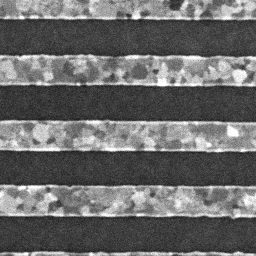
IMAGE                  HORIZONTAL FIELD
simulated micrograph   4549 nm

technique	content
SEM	one or a few lines or trenches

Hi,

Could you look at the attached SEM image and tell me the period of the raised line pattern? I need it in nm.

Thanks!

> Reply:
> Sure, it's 1160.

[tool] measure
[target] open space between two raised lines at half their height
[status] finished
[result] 675 nm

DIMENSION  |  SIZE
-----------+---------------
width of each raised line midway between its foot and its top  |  495 nm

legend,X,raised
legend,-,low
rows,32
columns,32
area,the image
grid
XXXXXXXXXXXXXXXXXXXXXXXXXXXXXXXX
XXXXXXXXXXXXXXXXXXXXXXXXXXXXXXXX
--------------------------------
--------------------------------
--------------------------------
--------------------------------
--------------------------------
XXXXXXXXXXXXXXXXXXXXXXXXXXXXXXXX
XXXXXXXXXXXXXXXXXXXXXXXXXXXXXXXX
XXXXXXXXXXXXXXXXXXXXXXXXXXXXXXXX
-----XX-XXX-------XXXXXXXXX-XXXX
--------------------------------
--------------------------------
--------------------------------
--------------------------------
XXXXXXXXXXXXXXXXXXXXXXXXXXXXXX-X
XXXXXXXXXXXXXXXXXXXXXXXXXXXXXXXX
XXXXXXXXXXXXXXXXXXXXXXXXXXXXXXXX
XXXXXXXXXXXXXXXXXXXXXXXXXXXXXXXX
--------------------------------
--------------------------------
--------------------------------
--------------------------------
XXXXXXXXXXXXXXXXXXXXXXXXXXXXXXX-
XXXXXXXXXXXXXXXXXXXXXXXXXXXXXXXX
XXXXXXXXXXXXXXXXXXXXXXXXXXXXXXXX
XXXXXXXXXXXXXXXXXXXXXXXXXXXXXXXX
--------------------------------
--------------------------------
--------------------------------
--------------------------------
--------------------------------